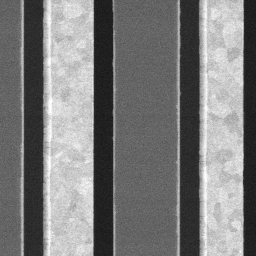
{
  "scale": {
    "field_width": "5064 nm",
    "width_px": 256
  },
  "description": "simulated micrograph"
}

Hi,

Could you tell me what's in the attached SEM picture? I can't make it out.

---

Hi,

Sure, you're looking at lines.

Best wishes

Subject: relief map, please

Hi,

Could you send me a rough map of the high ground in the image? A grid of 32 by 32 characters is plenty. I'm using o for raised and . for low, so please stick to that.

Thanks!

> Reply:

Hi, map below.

ooo...oooooo..oooooooo...ooooo..
ooo...oooooo..oooooooo...ooooo..
ooo...oooooo..oooooooo...ooooo..
ooo...oooooo..oooooooo...ooooo..
ooo...oooooo..oooooooo...ooooo..
ooo...oooooo..oooooooo...ooooo..
ooo...oooooo..oooooooo...ooooo..
ooo...oooooo..oooooooo...ooooo..
ooo...oooooo..oooooooo...ooooo..
ooo...oooooo..oooooooo...ooooo..
ooo...oooooo..oooooooo...ooooo..
ooo...oooooo..oooooooo...ooooo..
ooo...oooooo..oooooooo...ooooo..
ooo...oooooo..oooooooo...ooooo..
ooo...oooooo..oooooooo...ooooo..
ooo...oooooo..oooooooo...ooooo..
ooo...oooooo..oooooooo...ooooo..
ooo...oooooo..oooooooo...ooooo..
ooo...oooooo..oooooooo...ooooo..
ooo...oooooo..oooooooo...ooooo..
ooo...oooooo..oooooooo...ooooo..
ooo...oooooo..oooooooo...ooooo..
ooo...oooooo..oooooooo...ooooo..
ooo...oooooo..oooooooo...ooooo..
ooo...oooooo..oooooooo...ooooo..
ooo...oooooo..oooooooo...ooooo..
ooo...oooooo..oooooooo...ooooo..
ooo...oooooo..oooooooo...ooooo..
ooo...oooooo..oooooooo...ooooo..
ooo...oooooo..oooooooo...ooooo..
ooo...oooooo..oooooooo...ooooo..
ooo...oooooo..oooooooo...ooooo..